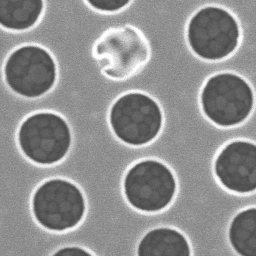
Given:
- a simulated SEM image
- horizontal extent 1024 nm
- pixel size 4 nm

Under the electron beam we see holes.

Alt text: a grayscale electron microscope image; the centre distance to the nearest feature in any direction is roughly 273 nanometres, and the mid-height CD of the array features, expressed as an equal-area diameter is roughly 0.201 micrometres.